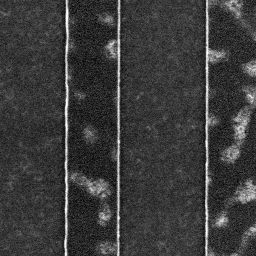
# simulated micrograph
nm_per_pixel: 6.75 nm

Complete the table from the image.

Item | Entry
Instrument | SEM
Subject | one or a few lines or trenches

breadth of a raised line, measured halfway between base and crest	0.356	micrometres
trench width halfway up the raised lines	590	nm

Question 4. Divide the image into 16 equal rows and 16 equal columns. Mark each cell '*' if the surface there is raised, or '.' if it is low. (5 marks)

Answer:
....***......***
....***......***
....***......***
....***......***
....***......***
....***......***
....***......***
....***......***
....***......***
....***......***
....***......***
....***......***
....***......***
....***......***
....***......***
....***......***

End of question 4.